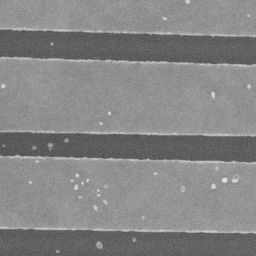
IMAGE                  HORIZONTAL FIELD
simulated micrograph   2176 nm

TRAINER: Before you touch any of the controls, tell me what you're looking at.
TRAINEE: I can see lines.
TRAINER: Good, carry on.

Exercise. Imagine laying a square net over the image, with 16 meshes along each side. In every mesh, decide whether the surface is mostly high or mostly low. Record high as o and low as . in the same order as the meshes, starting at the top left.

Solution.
oooooooooooooooo
oooooooooooooooo
................
................
oooooooooooooooo
oooooooooooooooo
oooooooooooooooo
oooooooooooooooo
...............o
................
oooooooooooooooo
oooooooooooooooo
oooooooooooooooo
oooooooooooooooo
...........ooooo
................